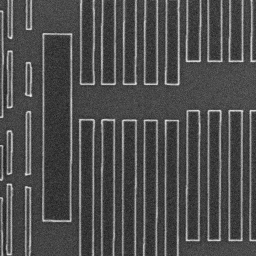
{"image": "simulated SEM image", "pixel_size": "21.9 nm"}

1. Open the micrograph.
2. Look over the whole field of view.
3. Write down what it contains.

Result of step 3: wiring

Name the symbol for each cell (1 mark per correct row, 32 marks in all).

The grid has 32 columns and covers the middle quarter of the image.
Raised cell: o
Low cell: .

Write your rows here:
oo..ooo..oooo..ooo..ooo..oooo...
oo..ooo..oooo..ooo..ooo..oooo...
oo..ooo..oooo..ooo..ooo..oooo...
oo..ooo..oooo..ooo..ooo..oooo...
oo..ooo..oooo..ooo..ooo..oooo...
oo..............................
oo..............................
oo..............................
oo..............................
oo..............................
oo..............................
oo..............................
oo.............................o
oo.............................o
oo..ooo..oooo..ooo..ooo..ooo...o
oo..ooo..oooo..ooo..ooo..ooo...o
oo..ooo..oooo..ooo..ooo..ooo...o
oo..ooo...ooo..ooo..ooo..ooo...o
oo..ooo...ooo..ooo..ooo..ooo...o
oo..ooo...ooo..ooo..ooo..ooo...o
oo..ooo...ooo..ooo..ooo..ooo...o
oo..ooo...ooo..ooo..ooo..ooo...o
oo..ooo...ooo..ooo..ooo..ooo...o
oo..ooo...ooo..ooo..ooo..ooo...o
oo..ooo..oooo..ooo..ooo..ooo...o
oo..ooo..oooo..ooo..ooo..ooo...o
oo..ooo..oooo..ooo..ooo..ooo...o
oo..ooo..oooo..ooo..ooo..ooo...o
oo..ooo..oooo..ooo..ooo..ooo...o
oo..ooo..oooo..ooo..ooo..ooo...o
oo..ooo..oooo..ooo..ooo..ooo...o
oo..ooo..oooo..ooo..ooo..ooo...o